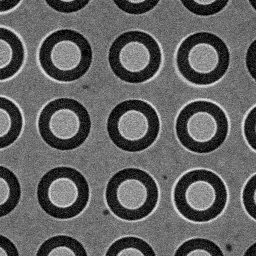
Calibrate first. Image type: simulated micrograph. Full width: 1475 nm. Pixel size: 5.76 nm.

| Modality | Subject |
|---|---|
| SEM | an array of small figures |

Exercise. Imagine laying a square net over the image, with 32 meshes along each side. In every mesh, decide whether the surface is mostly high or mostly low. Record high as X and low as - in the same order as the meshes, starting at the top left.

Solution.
--XXXX-----XXX------XXX-----XXX-
-XXXXXX--XXXXXXX--XXXXXX---XXXXX
XXXXXXXXXXXXXXXXXXXXXXXXXXXXXXXX
-XXXXXXXXXXXXXXXXXXXXXXXXXXXXXXX
--XXXX----XXXXX----XXXXX---XXXXX
---XX------XXX------XXX-----XXX-
---XX-------XX------XX-------XX-
---XX-------XX------XX-------XX-
---XX------XXX------XX------XXX-
--XXXX----XXXXX----XXXX-----XXX-
XXXXXXXXXXXXXXXXXXXXXXXX--XXXXXX
XXXXXXXXXXXXXXXXXXXXXXXXXXXXXXXX
-XXXXXX--XXXXXXX-XXXXXXXXXXXXXXX
--XXX------XXX-----XXXX-----XXXX
---XX------XXX------XX------XXX-
---XX------XX-------XX-------X--
---XX------XX-------XX-------X--
--XXX------XXX-----XXX------XXX-
XXXXXXX--XXXXXX---XXXXX----XXXX-
XXXXXXXXXXXXXXXXXXXXXXXXXXXXXXXX
XXXXXXXXXXXXXXXXXXXXXXXXXXXXXXXX
--XXXX----XXXXX---XXXXX----XXXXX
--XXX------XXX-----XXX------XXX-
---XX------XX-------XX------XX--
---XX------XX-------XX------XX--
--XXX------XX-------XX------XX--
-XXXXX----XXXX-----XXX------XXX-
XXXXXXXXXXXXXXX--XXXXXXX--XXXXXX
XXXXXXXXXXXXXXXXXXXXXXXXXXXXXXXX
XXXXXXX--XXXXXXXXXXXXXXXXXXXXXXX
--XXX-----XXXX-----XXXX----XXXXX
--XXX------XX------XXX------XXX-